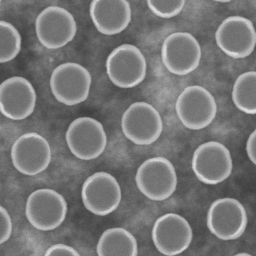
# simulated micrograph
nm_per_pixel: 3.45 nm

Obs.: a regular array of raised bodies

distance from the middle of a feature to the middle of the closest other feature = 0.197 micrometres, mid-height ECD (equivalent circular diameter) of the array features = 137 nm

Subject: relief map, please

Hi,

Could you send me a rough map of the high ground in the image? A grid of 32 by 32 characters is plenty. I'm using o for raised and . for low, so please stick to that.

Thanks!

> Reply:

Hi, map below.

............oooo...oooo.........
.....ooo...ooooo...ooo..........
.....oooo...oooo............ooo.
oo...oooo...ooo............ooooo
oo...oooo............ooo...ooooo
oo...ooo.............oooo..ooooo
oo............ooo...ooooo...ooo.
o............ooooo..ooooo.......
.......ooo...ooooo...ooo........
.......oooo...oooo............oo
oooo..ooooo....oo............ooo
oooo...oooo............ooo...ooo
oooo....oo............ooooo..ooo
oooo............ooo...ooooo...oo
.oo............ooooo..ooooo.....
.........ooo...ooooo...ooo......
........ooooo...oooo............
..oooo..ooooo....oo............o
..oooo...oooo............ooo...o
..oooo....oo............ooooo..o
..oooo............ooo...ooooo...
...oo............ooooo..ooooo...
...........ooo...ooooo...ooo....
..........ooooo...oooo..........
....ooo...ooooo...ooo...........
...ooooo...oooo............ooo..
o..ooooo....oo............ooooo.
o...oooo............ooo...ooooo.
o....o.............ooooo..oooo..
o............ooo...ooooo...ooo..
............ooooo..ooooo........
......ooo...ooooo...ooo.........